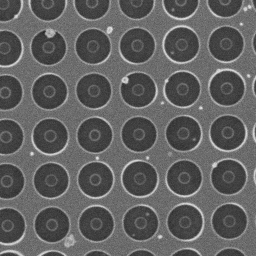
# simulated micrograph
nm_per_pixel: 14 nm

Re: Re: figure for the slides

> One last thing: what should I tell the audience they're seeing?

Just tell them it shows an array of small figures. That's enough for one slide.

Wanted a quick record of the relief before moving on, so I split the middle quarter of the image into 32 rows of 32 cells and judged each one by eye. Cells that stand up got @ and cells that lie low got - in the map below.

@@@@@@@@@@@@@@@@@@@@@@@@@@@@@@@@
@@@@@@@@@@@@@@@@@@@@@@@@@@@@@@@@
@@@@@@---@@@@@@@----@@@@@@@-----
@@@@-------@@@@@------@@@@------
@@@--------@@@@@-------@@@------
-@@---------@@---------@@-------
-@@---------@@---------@@-------
-@@---------@@---------@@-------
-@@---------@@@--------@@@------
@@@@-------@@@@-------@@@@------
@@@@@-----@@@@@@-----@@@@@@@---@
@@@@@@@@@@@@@@@@@@@@@@@@@@@@@@@@
@@@@@@@@@@@@@@@@@@@@@@@@@@@@@@@@
@@@@@@---@@@@@@@@---@@@@@@@@----
@@@@@------@@@@@------@@@@@-----
@@@@--------@@@--------@@@------
-@@---------@@---------@@-------
-@@---------@@---------@@-------
-@@---------@@---------@@@------
-@@@--------@@@--------@@@------
@@@@-------@@@@-------@@@@@-----
@@@@@-----@@@@@@@----@@@@@@@----
@@@@@@@@@@@@@@@@@@@@@@@@@@@@@@@@
@@@@@@@@@@@@@@@@@@@@@@@@@@@@@@@@
@@@@@@@--@@@@@@@@---@@@@@@@@----
@@@@@------@@@@@------@@@@@-----
@@@@--------@@@--------@@@------
-@@@--------@@@--------@@@------
-@@---------@@---------@@-------
-@@---------@@---------@@@------
-@@@--------@@@--------@@@------
-@@@--------@@@--------@@@@-----